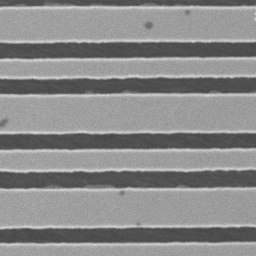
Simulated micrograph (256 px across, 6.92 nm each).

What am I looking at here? lines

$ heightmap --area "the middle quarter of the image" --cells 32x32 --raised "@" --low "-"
@@@@@@@@@@@@@@@@@@@@@@@@@@@@@@@@
@@@@@@@@@@@@@@@@@@@@@@@@@@@@@@@@
@@@@@@@@@@@@@@@@@@@@@@@@@@@@@@@@
@@@@@@@@@@@@@@@@@-@@@@---@@@@@@-
--------------------------------
--------------------------------
--------------------------------
------------@@@@@@@@@@@@@@@@@@@@
@@@@@@@@@@@@@@@@@@@@@@@@@@@@@@@@
@@@@@@@@@@@@@@@@@@@@@@@@@@@@@@@@
@@@@@@@@@@@@@@@@@@@@@@@@@@@@@@@@
@@@@@@@@@@@@@@@@@@@@@@@@@@@@@@@@
@@@@@@@@@@@@@@@@@@@@@@@@@@@@@@@@
@@@@@@@@@@@@@@@@@@@@@@@@@@@@@@@@
@@@@@@@@@@@@@@@@@@@@@@@@@@@@@@@@
@@@@@@@@@@@@@@@@@@@@@@@@@@@@@@@@
@@@@@@@@@@@@@@@@@@@@@@@@@@@@@@@@
--------------------------------
--------------------------------
--------------------------------
--------------------------------
----@@@@@@@@@@@@@@@@@@@@@@@@@@@@
@@@@@@@@@@@@@@@@@@@@@@@@@@@@@@@@
@@@@@@@@@@@@@@@@@@@@@@@@@@@@@@@@
@@@@@@@@@@@@@@@@@@@@@@@@@@@@@@@@
@@@@@@@@@@@@@@@@@@@@@@@@@@@@@@@@
@@@@@@@@@@@@@@@@@@@@@@@@@@@@@@@@
--------------------------------
--------------------------------
--------------------------------
--------------------------------
@@@@@@@@@@@@@@@@@@@@@@@@@@@@@@@@